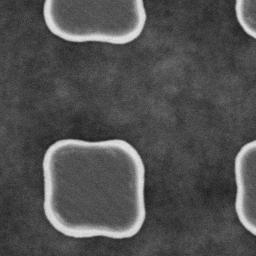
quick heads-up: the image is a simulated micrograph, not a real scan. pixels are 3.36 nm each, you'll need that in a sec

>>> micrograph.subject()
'raised bodies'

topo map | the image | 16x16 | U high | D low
DDDUUUUUUDDDDDDU
DDDUUUUUUDDDDDDU
DDDDDDDUDDDDDDDD
DDDDDDDDDDDDDDDD
DDDDDDDDDDDDDDDD
DDDDDDDDDDDDDDDD
DDDDDDDDDDDDDDDD
DDDDDDDDDDDDDDDD
DDDDDDDDDDDDDDDD
DDDUUUUUDDDDDDDU
DDDUUUUUUDDDDDDU
DDDUUUUUUDDDDDDU
DDDUUUUUUDDDDDDU
DDDUUUUUUDDDDDDU
DDDDUUUUDDDDDDDD
DDDDDDDDDDDDDDDD